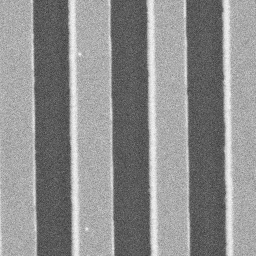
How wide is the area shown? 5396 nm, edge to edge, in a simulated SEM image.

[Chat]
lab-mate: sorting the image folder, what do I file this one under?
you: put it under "lines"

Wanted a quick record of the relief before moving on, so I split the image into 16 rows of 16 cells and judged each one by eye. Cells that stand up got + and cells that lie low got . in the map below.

++..+++..+++..++
++..+++..+++..++
++..+++..+++..++
++..+++..+++..++
++..+++..+++..++
++..+++..+++..++
++..+++..+++..++
++..+++..+++..++
++..+++..+++..++
++...++..+++..++
++...++..+++..++
++...++..+++..++
++...++..+++..++
++...++..+++..++
++...++..+++..++
++...++..+++..++